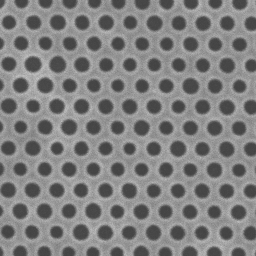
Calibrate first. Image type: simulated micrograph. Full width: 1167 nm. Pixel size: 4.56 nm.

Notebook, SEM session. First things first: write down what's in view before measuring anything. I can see a regular array of holes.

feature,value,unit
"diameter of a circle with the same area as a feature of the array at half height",0.067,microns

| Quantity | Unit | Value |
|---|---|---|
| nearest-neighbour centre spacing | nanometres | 110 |